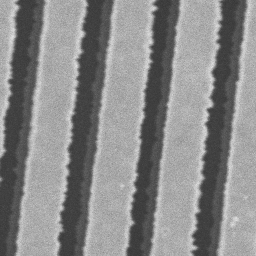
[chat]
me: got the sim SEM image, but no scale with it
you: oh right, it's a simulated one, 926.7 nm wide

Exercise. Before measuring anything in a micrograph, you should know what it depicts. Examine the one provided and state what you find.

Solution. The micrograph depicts lines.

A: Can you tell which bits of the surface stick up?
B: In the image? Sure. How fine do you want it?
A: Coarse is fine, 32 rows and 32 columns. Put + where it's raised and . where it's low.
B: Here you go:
++....+++++...+++++...++++++...+
++...++++++...+++++...++++++...+
++...+++++....+++++...++++++...+
++...+++++....+++++...+++++...++
++...+++++....+++++...+++++...++
++...+++++....+++++...+++++...++
++...+++++...++++++...+++++...++
+....+++++...++++++...+++++...++
+....+++++...++++++...+++++...++
+...++++++...+++++...++++++...++
+...++++++...+++++...++++++...++
+...++++++...+++++...+++++...+++
+...+++++....+++++...+++++...+++
+...+++++....+++++...+++++...+++
+...+++++...++++++...+++++...+++
+...+++++...++++++...+++++...+++
+...+++++...++++++..++++++...+++
+...+++++...++++++..++++++...+++
+...+++++...+++++...++++++...+++
...++++++...+++++...+++++....+++
...++++++...+++++...+++++...++++
...++++++...+++++...+++++...++++
...+++++....+++++...+++++...++++
...+++++...++++++...+++++...++++
...+++++...++++++...+++++...++++
...+++++...++++++...+++++...++++
...+++++...+++++...++++++...++++
..+++++....++++++..++++++...++++
..++++++...+++++...+++++....++++
..+++++....+++++...+++++...+++++
..+++++....+++++...+++++...+++++
..+++++...++++++...+++++...+++++